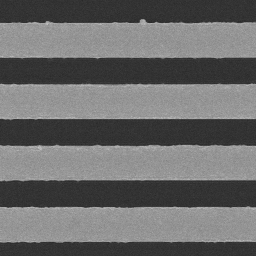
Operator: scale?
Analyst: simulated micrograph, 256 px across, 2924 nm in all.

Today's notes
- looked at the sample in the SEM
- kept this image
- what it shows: lines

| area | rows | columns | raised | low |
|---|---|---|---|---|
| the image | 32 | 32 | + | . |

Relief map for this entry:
................................
................................
................................
++++++++++++++++++++++++++++++++
++++++++++++++++++++++++++++++++
++++++++++++++++++++++++++++++++
++++++++++++++++++++++++++++++++
................................
................................
................................
++........++...+++..+......+...+
++++++++++++++++++++++++++++++++
++++++++++++++++++++++++++++++++
++++++++++++++++++++++++++++++++
++++++++++++++++++++++++++++++++
................................
................................
................................
++++++++++++++++++++++++++++++++
++++++++++++++++++++++++++++++++
++++++++++++++++++++++++++++++++
++++++++++++++++++++++++++++++++
++++.+.+........................
................................
................................
................................
++++++++++++++++++++++++++++++++
++++++++++++++++++++++++++++++++
++++++++++++++++++++++++++++++++
++++++++++++++++++++++++++++++++
................................
................................